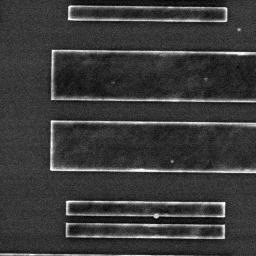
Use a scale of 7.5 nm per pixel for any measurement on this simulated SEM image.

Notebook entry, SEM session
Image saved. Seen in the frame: wiring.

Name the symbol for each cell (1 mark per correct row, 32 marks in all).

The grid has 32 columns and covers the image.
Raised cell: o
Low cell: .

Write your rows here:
................................
.........ooooooooooooooooooo....
.........ooooooooooooooooooo....
................................
................................
................................
.......ooooooooooooo............
.......ooooooooooooooooooooooooo
......oooooooooooooooooooooooooo
......oooooooooooooooooooooooooo
......oooooooooooooooooooooooooo
......oooooooooooooooooooooooooo
..............oooooooooooooooooo
................................
................................
......oooooooooooooooooooooooooo
......oooooooooooooooooooooooooo
......oooooooooooooooooooooooooo
......oooooooooooooooooooooooooo
......oooooooooooooooooooooooooo
......oooooooooooooooooooooooooo
............................oooo
................................
................................
................................
........oooooooooooooooooooo....
........oooooooooooooooooooo....
................................
........oooooooooooooooooooo....
........oooooooooooooooooooo....
................................
................................